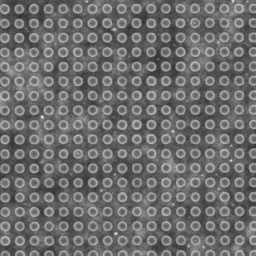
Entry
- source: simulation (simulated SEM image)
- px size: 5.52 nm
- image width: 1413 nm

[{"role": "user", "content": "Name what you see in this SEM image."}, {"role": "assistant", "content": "a regular array of raised bodies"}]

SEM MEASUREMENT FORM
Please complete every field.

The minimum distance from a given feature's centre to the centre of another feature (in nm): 78.8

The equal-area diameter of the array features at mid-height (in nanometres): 50.2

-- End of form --